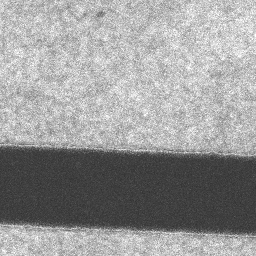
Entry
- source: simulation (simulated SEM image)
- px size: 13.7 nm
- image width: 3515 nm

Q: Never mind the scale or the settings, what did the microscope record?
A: one or a few lines or trenches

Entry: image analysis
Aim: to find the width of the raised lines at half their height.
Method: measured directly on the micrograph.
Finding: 1130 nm